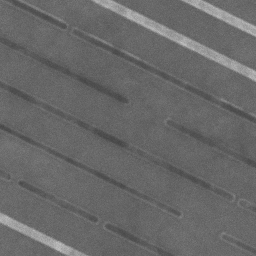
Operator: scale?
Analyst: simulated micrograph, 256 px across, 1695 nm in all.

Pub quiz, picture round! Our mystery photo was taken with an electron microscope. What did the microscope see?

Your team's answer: parallel lines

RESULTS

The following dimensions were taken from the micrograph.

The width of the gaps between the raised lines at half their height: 0.214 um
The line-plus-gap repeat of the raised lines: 39.9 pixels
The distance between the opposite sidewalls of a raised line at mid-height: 48.2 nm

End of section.